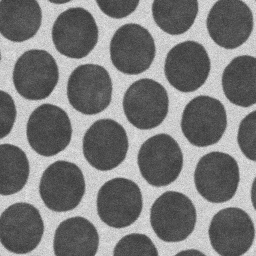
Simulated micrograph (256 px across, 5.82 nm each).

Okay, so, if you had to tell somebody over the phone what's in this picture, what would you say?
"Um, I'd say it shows a regular array of holes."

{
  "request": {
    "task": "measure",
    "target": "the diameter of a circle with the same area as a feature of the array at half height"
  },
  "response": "282 nm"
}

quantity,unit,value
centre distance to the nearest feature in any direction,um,0.33